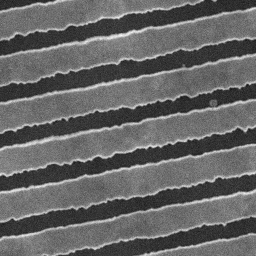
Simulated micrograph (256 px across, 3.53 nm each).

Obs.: lines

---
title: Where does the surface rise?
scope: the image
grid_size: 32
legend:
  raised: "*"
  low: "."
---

....********************........
******************...........***
************............********
********..........**************
**............******************
........*******************.....
..********************..........
******************..........****
***********.............********
******............**************
*...........*******************.
......********************......
..********************.........*
***************.*.........******
**********...........***********
*****..........*****************
*.........*******************...
.....*******************........
******************...........***
**************.........*********
*********..........*************
***..........*******************
.........******************.....
...*******************..........
******************..........****
************...........*********
******...........***************
*............*****************..
......******************........
..*******************.........**
**************...........*******
*********...........************